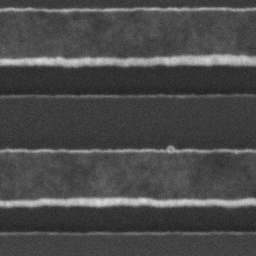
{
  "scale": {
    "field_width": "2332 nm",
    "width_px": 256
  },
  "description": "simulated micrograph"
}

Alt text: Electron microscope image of lines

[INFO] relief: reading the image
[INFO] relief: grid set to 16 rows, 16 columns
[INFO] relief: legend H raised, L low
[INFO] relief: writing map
LLLLLLLLLLLLLLLL
HHHHHHHHHHHHHHHH
HHHHHHHHHHHHHHHH
HHHHHHHHHHHHHHHH
LLLLLLLLLLLLLLLL
LLLLLLLLLLLLLLLL
LLLLLLLLLLLLLLLL
LLLLLLLLLLLLLLLL
LLLLLLLLLLLLLLLL
HHHHHHHHHHHHHHHH
HHHHHHHHHHHHHHHH
HHHHHHHHHHHHHHHH
HHHHHHHHHHHHHHHH
LLLLLLLLLLLLLLLL
LLLLLLLLLLLLLLLL
LLLLLLLLLLLLLLLL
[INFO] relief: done